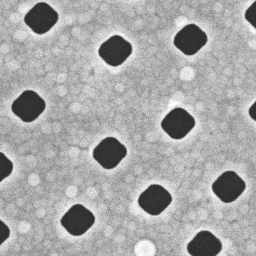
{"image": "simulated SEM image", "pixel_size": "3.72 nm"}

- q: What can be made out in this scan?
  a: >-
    a regular array of holes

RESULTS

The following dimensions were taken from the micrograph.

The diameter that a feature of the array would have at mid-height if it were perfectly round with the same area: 116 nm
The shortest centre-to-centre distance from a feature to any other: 279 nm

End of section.